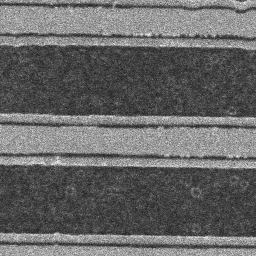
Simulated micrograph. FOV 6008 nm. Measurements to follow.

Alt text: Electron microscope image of one or a few lines or trenches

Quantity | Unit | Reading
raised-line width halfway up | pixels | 75.9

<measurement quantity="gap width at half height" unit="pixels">42.9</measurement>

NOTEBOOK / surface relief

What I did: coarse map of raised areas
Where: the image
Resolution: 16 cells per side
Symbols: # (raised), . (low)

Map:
................
................
................
################
################
################
################
.............###
................
................
################
################
################
################
################
................